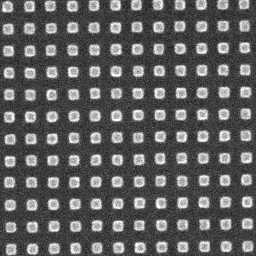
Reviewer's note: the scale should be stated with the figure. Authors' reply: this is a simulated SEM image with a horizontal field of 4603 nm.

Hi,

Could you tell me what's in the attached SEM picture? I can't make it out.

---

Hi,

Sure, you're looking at a regular array of raised bodies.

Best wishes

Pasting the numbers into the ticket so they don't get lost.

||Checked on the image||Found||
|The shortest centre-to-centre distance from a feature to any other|0.381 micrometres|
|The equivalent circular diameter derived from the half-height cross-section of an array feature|0.185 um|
